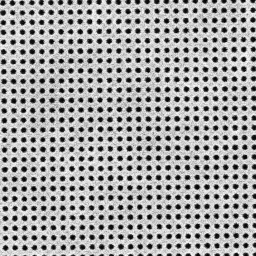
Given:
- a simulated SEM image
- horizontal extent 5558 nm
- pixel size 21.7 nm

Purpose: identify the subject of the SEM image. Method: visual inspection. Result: a regular array of holes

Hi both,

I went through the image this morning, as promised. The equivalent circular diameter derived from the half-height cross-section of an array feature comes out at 134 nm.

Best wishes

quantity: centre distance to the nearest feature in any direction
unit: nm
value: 201